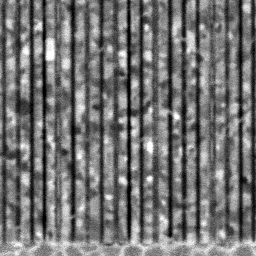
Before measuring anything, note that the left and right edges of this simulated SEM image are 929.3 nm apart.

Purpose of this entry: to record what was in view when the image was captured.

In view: parallel lines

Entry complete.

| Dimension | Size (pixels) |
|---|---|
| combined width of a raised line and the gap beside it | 13.9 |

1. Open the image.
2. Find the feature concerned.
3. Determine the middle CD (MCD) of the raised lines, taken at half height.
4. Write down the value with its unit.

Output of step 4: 30.8 nm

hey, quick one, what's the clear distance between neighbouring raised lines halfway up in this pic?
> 18.8 nanometers